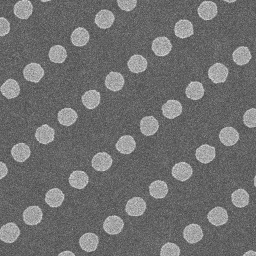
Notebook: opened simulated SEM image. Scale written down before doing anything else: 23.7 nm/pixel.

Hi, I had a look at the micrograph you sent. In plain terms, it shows a regular array of raised bodies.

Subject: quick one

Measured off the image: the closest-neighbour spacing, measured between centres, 28.9 px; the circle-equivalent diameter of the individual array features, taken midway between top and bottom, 0.436 microns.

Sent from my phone